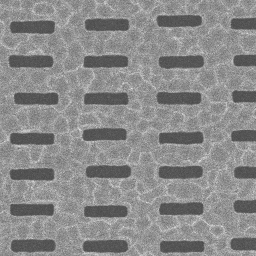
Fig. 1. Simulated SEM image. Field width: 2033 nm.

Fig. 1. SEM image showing a regular array of holes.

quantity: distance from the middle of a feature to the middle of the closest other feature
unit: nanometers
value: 283